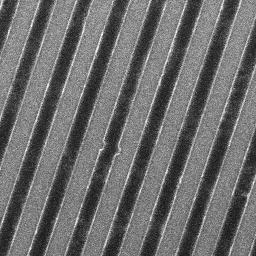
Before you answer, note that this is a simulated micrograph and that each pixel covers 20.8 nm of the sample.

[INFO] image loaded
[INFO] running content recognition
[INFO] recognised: parallel lines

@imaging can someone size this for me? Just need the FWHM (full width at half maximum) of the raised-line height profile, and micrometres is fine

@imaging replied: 0.345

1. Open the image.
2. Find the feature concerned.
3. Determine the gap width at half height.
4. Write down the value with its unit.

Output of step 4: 374 nm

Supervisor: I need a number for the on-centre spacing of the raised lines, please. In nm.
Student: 727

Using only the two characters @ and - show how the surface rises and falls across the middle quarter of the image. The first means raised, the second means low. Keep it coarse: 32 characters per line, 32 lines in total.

@@------@@@-----@@@@-----@@@@@--
@@-----@@@@-----@@@@-----@@@@---
@------@@@-----@@@@@-----@@@@---
@-----@@@@-----@@@@-----@@@@@---
-----@@@@@-----@-@@-----@@@@----
-----@@@@-----@@-@@----@@@@@----
-----@@@@-----@--@-----@@@@@----
----@@@@@-----@@@@-----@@@@-----
----@@@@-----@@@@@----@@@@@-----
----@@@@-----@@@@-----@@@@@----@
---@@@@@-----@@@@-----@@@@-----@
---@@@@-----@@@@@----@@@@@-----@
---@@@@-----@@@@-----@@@@@----@@
--@@@@@-----@@@@-----@@@@-----@@
--@@@@-----@@@@@----@@@@@-----@@
--@@@@-----@@@@-----@@@@@----@@@
-@@@@@-----@@@@-----@--@-----@@@
-@@@@-----@@@@@----@---@-----@@@
-@@@@-----@@@@-----@--------@@@@
@@@@@-----@@@@-----@@@@-----@@@@
@@@@------@@@@----@@@@@-----@@@@
@@@@-----@@@@@----@@@@@----@@@@@
@@@@-----@@@@@----@@@@-----@@@@@
@@@-----@@@@@----@@@@@-----@@@@-
@@@-----@@@@-----@@@@@----@@@@@-
@@@-----@@@@-----@@@@-----@@@@@-
@@-----@@@@@----@@@@@-----@@@@--
@@-----@@@@-----@@@@-----@@@@@--
@@-----@@@@-----@-@@-----@@@@---
@-----@@@@@----@@@@@-----@@@@---
@-----@@@@-----@@@@@----@@@@@---
@-----@@@@-----@@@@-----@@@@----